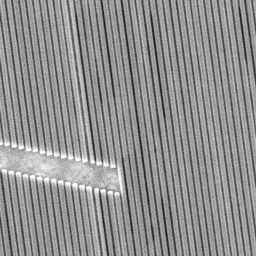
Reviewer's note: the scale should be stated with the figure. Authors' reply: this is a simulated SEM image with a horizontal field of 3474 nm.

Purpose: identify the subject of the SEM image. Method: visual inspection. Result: parallel lines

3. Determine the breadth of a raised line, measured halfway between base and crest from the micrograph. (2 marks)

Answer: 60.5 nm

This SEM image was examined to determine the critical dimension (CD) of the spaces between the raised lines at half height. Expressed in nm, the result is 37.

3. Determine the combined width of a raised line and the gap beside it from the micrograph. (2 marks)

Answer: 0.0922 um